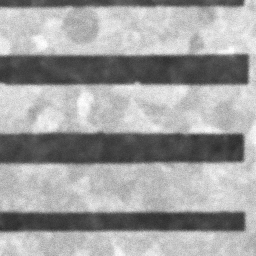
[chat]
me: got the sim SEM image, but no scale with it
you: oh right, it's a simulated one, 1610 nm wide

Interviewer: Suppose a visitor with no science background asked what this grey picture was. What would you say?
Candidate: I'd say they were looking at one or a few lines or trenches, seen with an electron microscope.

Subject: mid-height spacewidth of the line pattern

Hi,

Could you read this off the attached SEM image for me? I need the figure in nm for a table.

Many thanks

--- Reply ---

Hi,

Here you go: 191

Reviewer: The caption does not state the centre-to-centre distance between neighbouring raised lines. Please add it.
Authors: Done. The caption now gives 0.487 um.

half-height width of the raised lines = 292 nm